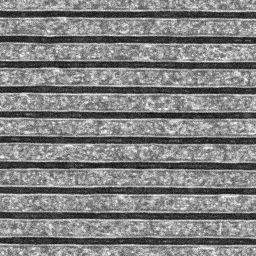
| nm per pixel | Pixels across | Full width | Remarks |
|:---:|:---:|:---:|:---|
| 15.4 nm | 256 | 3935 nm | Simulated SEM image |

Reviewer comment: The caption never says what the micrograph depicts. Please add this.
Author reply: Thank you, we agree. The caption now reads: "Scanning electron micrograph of parallel lines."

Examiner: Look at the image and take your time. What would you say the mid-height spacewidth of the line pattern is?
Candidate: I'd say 121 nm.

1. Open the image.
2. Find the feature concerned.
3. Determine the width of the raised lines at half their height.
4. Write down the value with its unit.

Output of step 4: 275 nanometres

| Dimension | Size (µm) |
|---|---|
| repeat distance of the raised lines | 0.387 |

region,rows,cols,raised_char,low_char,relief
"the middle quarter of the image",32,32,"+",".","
................................
+++++++++++++++++++++++++++.....
++++++++++++++++++++++++++++++++
++++++++++++++++++++++++++++++++
++++++++++++++++++++++++++++++++
.....................+++++++++++
................................
......................+.........
++++++++++++++++++++++++++++++++
++++++++++++++++++++++++++++++++
++++++++++++++++++++++++++++++++
++++++++++++++++++++++++++++++++
................................
................................
++++++++++++++++++++++++++++++++
++++++++++++++++++++++++++++++++
++++++++++++++++++++++++++++++++
++++++++++++++++++++++++++++++++
................................
................................
++++++++++++++++++++++++++++++++
++++++++++++++++++++++++++++++++
++++++++++++++++++++++++++++++++
++++++++++++++++++++++++++++++++
................................
................................
.+++++++++++++++++++++++++++++++
++++++++++++++++++++++++++++++++
++++++++++++++++++++++++++++++++
++++++++++++++++++++++++++++++++
+++++++++++++++++++++++.++++++++
................................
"